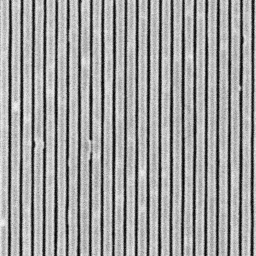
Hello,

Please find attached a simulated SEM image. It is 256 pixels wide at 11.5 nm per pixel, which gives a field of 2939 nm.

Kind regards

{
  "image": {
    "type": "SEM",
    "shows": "parallel lines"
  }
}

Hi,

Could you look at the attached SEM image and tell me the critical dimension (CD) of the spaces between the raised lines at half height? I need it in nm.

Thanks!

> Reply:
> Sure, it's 34.4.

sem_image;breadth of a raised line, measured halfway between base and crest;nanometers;90.4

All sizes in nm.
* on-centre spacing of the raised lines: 133